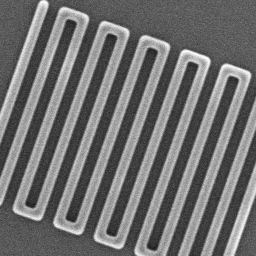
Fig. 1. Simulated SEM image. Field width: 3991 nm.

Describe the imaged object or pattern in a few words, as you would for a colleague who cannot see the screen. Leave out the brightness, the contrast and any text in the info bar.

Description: groups of lines, slits or small figures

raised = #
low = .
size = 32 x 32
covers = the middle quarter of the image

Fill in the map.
##...###...###...##...###...###.
##...##....##...###...###...##..
#....##...###...##....##...###..
#...###...##....##...###...##...
#...##....##...###...##....##...
....##...###...##....##...###...
...###...##....##...###...##....
...##....##...###...##....##...#
...##...###...##....##...###...#
..###...##....##...###...##....#
..##....##...###...##....##...##
..##...###...##....##...###...##
.###...##....##...###...##....##
.##....##...###...##....##...###
###...###...##....##...###...##.
###...##...###...###...##....##.
##...###...###...##...###...###.
##...##....##...###...###...##..
#....##....##...###...##...###..
#...###...##....##....##...###..
#...###...##...###...##....##...
....##...###...###...##...###...
...###...##....##...###...###...
...##....##...###...##....##...#
...##...###...##....##...###...#
..###...###...##...###...##....#
..##....##...###...###...##...##
..##...###...##....##...###...##
.###...##....##...###...##....##
.##....##...###...##....##...###
.##...###...##....##...###...##.
###...##....##...###...##....##.